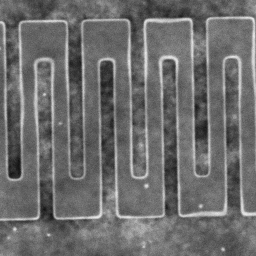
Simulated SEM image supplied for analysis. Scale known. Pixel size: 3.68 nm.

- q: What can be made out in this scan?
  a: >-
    groups of lines, slits or small figures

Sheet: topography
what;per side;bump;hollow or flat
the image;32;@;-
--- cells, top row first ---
--------------------------------
--------------------------------
--------------@@------@@--@@@@@@
@-@@@@@@--@@@@@@--@@@@@@--@@@@@@
@-@@@@@@--@@@@@@--@@@@@@--@@@@@@
@--@@@@@--@@@@@@--@@@@@@--@@@@@@
@--@@@@@--@@@@@@--@@@@@@--@@@@@@
@--@@-@@--@@@-@@--@@--@@--@@--@@
@--@---@--@@--@@--@@--@@--@@--@@
@--@---@--@@--@@--@@--@@--@@--@@
@--@---@--@@--@@--@@--@@--@@--@@
@--@---@@-@@--@@--@@--@@--@@--@@
@--@---@@-@@--@@--@@--@@--@@--@@
@--@---@@-@@@-@@--@@--@@--@@--@@
@--@@--@@-@@@-@@--@@--@@--@@--@@
@--@@--@@-@@@-@@--@@--@@--@@--@@
@--@@--@@-@@@-@@--@@--@@--@@--@@
@--@@--@@--@@-@@--@@--@@--@@--@@
@--@@--@@--@@-@@--@@--@@--@@--@@
@--@@--@@--@@--@--@@--@@--@@--@@
@--@@--@@--@@--@--@@--@@--@@--@@
@--@@--@@--@@--@@-@@--@@--@@--@@
@@@@@--@@@@@@--@@@@@--@@@@@@--@@
@@@@@--@@@@@@--@@@@@--@@@@@@--@@
@@@@@--@@@@@@--@@@@@--@@@@@@--@@
@@@@@--@@@@@@--@@@@@--@@@@@@--@@
@@@@@--@@@@@@--@@@@@--@@@@@@--@@
--------------------------------
--------------------------------
--------------------------------
--------------------------------
--------------------------------